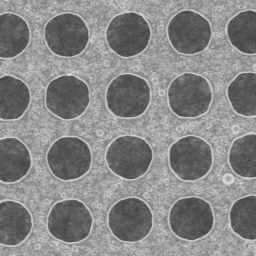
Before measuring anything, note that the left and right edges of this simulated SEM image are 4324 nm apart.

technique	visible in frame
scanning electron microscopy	a regular array of holes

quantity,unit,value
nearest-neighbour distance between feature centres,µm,1.02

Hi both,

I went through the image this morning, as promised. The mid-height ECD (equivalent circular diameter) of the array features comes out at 746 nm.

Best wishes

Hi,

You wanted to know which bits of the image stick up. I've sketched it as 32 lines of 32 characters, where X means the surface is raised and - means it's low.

XXXXXXXXXXXXXXXXXXXXXXXXXXXXXXXX
XXXXXXXXXXXXXXXXXXXXXXX-XXXXXX--
---XXX----XXXX----XXX-----XXX---
----XX-----XX------XX-----XX----
----XX-----XX------XX-----XXX---
---XXX-----XXX----XXX-----XXX---
---XXXX---XXXX----XXXX---XXXXX--
XXXXXXXXXXXXXXXXXXXXXXXXXXXXXXXX
XXXXXXXXXXXXXXXXXXXXXXXXXXXXXXXX
XXXXXXXX-XXXXXX--XXXXX---XXXXX--
---XXX-----XXX----XXX-----XXX---
----XX-----XX------XX-----XX----
----XX-----XX------XX-----XXX---
---XXX-----XXX----XXX-----XXX---
---XXXX---XXXXX--XXXXX---XXXXXX-
XXXXXXXXXXXXXXXXXXXXXXXXXXXXXXXX
XXXXXXXXXXXXXXXXXXXXXXXXXXXXXXXX
--XXXXX---XXXX----XXXX---XXXX---
---XXX-----XXX-----XX-----XXX---
----XX-----XX------XX------XX---
----XX-----XX------XX-----XXX---
---XXXX----XXX----XXXX----XXX---
--XXXXXX-XXXXXXXXXXXXXX--XXXXXXX
XXXXXXXXXXXXXXXXXXXXXXXXXXXXXXXX
XXXXXXXXXXXXXXXXXXXXXXXXXXXXXXX-
--XXXXX---XXXX----XXXX----XXX---
----XX-----XXX-----XX------XX---
----XX------XX-----XX------XX---
----XX-----XXX-----XX-----XXX---
---XXXX----XXX----XXXX----XXXX--
--XXXXXXXXXXXXXXXXXXXXXXXXXXXXXX
XXXXXXXXXXXXXXXXXXXXXXXXXXXXXXXX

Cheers